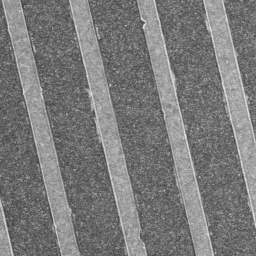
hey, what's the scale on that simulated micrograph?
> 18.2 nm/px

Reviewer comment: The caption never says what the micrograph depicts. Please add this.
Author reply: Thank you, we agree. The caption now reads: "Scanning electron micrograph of one or a few lines or trenches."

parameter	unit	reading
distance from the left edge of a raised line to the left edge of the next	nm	1180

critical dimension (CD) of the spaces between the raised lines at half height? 0.877 um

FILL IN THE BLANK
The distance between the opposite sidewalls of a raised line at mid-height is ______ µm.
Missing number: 0.317